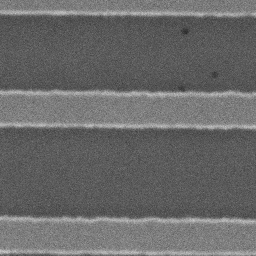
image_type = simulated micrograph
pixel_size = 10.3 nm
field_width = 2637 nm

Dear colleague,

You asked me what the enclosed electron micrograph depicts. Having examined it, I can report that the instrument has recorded lines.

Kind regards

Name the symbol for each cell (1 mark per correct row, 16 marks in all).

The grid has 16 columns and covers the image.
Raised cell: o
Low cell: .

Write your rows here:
oooooooooooooooo
................
................
................
................
................
oooooooooooooooo
oooooooooooooooo
................
................
................
................
................
................
oooooooooooooooo
oooooooooooooooo